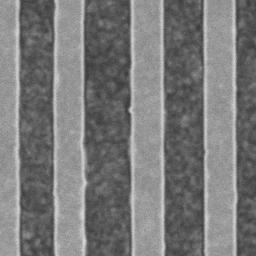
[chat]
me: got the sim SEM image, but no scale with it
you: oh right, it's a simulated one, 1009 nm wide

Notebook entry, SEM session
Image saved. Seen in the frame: one or a few lines or trenches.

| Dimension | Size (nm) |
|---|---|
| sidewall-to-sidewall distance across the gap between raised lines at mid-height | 165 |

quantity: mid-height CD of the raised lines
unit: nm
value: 117